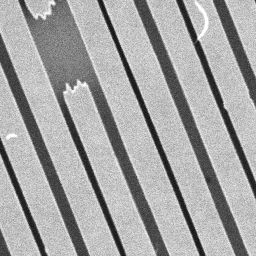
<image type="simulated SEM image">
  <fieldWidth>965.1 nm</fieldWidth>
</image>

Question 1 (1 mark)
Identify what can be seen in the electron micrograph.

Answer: parallel lines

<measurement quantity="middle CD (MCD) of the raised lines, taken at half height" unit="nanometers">102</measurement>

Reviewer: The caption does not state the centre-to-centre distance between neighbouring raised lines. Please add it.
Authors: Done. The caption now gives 138 nm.